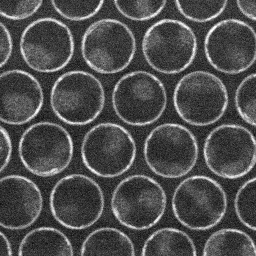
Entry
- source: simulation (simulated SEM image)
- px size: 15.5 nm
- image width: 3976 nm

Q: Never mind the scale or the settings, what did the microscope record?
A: a regular array of raised bodies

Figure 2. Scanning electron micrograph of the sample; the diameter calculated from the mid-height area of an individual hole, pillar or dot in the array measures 812 nanometres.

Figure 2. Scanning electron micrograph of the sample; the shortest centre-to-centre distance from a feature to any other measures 935 nm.